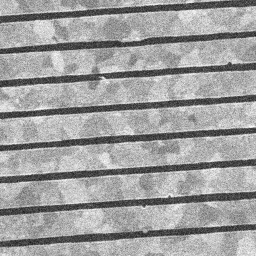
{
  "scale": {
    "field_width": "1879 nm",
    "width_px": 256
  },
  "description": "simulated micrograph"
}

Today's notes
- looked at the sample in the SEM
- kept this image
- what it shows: parallel lines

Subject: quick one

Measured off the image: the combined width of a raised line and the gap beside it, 235 nm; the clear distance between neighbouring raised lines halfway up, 55.8 nm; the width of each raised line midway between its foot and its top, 0.178 microns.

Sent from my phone